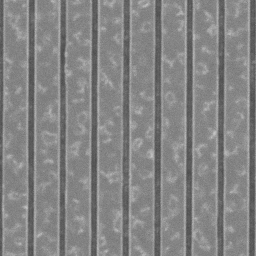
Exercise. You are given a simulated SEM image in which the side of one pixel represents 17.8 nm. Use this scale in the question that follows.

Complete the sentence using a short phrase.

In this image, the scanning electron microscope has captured parallel lines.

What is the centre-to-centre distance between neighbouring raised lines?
562 nm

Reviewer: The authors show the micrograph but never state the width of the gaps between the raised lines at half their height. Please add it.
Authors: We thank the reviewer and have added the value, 118 nm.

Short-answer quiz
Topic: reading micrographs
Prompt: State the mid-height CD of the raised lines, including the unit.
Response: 436 nm